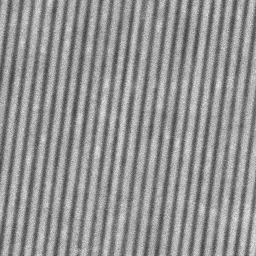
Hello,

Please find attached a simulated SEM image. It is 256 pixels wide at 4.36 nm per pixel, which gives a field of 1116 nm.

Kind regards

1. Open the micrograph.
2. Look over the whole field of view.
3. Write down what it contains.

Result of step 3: parallel lines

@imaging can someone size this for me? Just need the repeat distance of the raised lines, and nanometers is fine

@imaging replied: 48.6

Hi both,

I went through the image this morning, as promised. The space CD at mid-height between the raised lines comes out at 0.0286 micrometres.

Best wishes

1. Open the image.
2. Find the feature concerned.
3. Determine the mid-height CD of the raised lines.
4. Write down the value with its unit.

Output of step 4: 20.5 nm